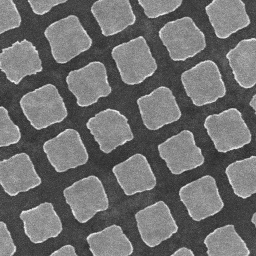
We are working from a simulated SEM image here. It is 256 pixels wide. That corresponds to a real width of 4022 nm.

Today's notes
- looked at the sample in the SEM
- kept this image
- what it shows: a regular array of raised bodies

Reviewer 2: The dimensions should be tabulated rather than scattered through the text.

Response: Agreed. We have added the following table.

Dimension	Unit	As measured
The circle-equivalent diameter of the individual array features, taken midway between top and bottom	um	0.645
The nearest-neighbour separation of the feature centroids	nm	781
